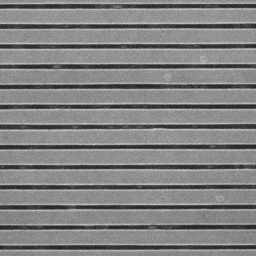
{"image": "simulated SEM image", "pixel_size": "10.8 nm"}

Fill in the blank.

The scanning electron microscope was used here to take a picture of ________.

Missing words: parallel lines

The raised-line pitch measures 216 nm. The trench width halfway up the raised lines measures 0.0511 micrometres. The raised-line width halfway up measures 165 nm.